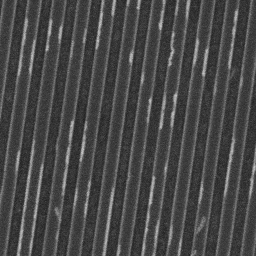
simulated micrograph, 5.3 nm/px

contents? parallel lines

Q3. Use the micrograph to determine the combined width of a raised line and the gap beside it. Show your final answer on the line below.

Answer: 0.13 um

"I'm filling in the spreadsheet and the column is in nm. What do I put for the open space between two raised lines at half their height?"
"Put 59.1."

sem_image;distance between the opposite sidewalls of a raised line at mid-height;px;13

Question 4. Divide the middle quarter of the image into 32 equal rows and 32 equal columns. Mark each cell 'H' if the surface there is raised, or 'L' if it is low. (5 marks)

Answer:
LHHHLLLHHHHLLLHHHLLLHHHLLLHHHLLL
LHHHLLLHHHHLLHHHHLLLHHHLLLHHHLLL
LHHHLLLHHHLLLHHHLLLLHHHLLLHHHLLL
LHHHLLLHHHLLLHHHLLLLHHHLLLHHHLLL
LHHHLLLHHHLLLHHHLLLHHHHLLHHHHLLL
LHHHLLLHHHLLLHHHLLLHHHLLLHHHLLLH
HHHLLLHHHHLLLHHHLLLHHHLLLHHHLLLH
HHHLLLHHHHLLLHHHLLLHHHLLLHHHLLLH
HHHLLLHHHHLLHHHHLLLHHHLLLHHHLLLH
HHHLLLHHHLLLHHHLLLLHHHLLLHHHLLLH
HHHLLLHHHLLLHHHLLLLHHHLLLHHHLLLH
HHHLLLHHHLLLHHHLLLHHHHLLHHHHLLLH
HHHLLLHHHLLLHHHLLLHHHLLLHHHHLLLH
HHHLLHHHHLLLHHHLLLHHHLLLHHHLLLLH
HHLLLHHHHLLLHHHLLLHHHLLLHHHLLLHH
HHLLLHHHHLLLHHHLLLHHHLLLHHHLLLHH
HHLLLHHHLLLHHHHLLLHHHLLLHHHLLLHH
HHLLLHHHLLLHHHLLLLHHHLLLHHHLLLHH
HHLLLHHHLLLHHHLLLHHHHLLLHHHLLLHH
HHLLLHHHLLLHHHLLLHHHLLLHHHHLLLHH
HHLLLHHHLLLHHHLLLHHHLLLHHHLLLLHH
HLLLHHHHLLLHHHLLLHHHLLLHHHLLLHHH
HLLLHHHHLLLHHHLLLHHHLLLHHHLLLHHH
HLLLHHHLLLHHHHLLLHHHLLLHHHLLLHHH
HLLLHHHLLLHHHLLLLHHHLLLHHHLLLHHH
HLLLHHHLLLHHHLLLHHHHLLLHHHLLLHHH
HLLLHHHLLLHHHLLLHHHLLLHHHHLLLHHH
HLLLHHHLLLHHHLLLHHHLLLHHHLLLLHHH
LLLHHHHLLLHHHLLLHHHLLLHHHLLLHHHH
LLLHHHHLLLHHHLLLHHHLLLHHHLLLHHHL
LLLHHHLLLHHHHLLLHHHLLLHHHLLLHHHL
LLLHHHLLLHHHLLLLHHHLLLHHHLLLHHHL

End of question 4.